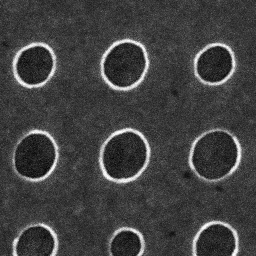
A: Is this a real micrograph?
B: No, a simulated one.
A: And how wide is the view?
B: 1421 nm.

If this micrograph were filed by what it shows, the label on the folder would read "holes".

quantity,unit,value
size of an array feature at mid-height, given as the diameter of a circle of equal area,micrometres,0.241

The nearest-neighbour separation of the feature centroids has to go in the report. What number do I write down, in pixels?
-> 89.9